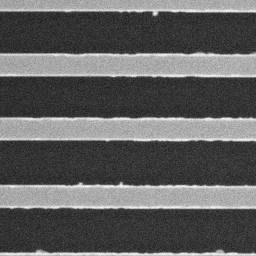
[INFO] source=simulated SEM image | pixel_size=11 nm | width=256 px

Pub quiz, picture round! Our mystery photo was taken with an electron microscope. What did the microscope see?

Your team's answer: lines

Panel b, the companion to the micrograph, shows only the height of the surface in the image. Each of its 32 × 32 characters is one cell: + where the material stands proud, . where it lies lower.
++++++++++++++++++++++++++++++++
................................
................................
................................
................................
................................
................................
++++++++++++++++++++++++++++++++
++++++++++++++++++++++++++++++++
..............+++..+++++++++++++
................................
................................
................................
................................
................................
++++++++++++++++++++++++++++++++
++++++++++++++++++++++++++++++++
.............+..++++++++.+++++++
................................
................................
................................
................................
................................
++++++++++++++++++++++++++++++++
++++++++++++++++++++++++++++++++
++++++++++++++++++++++++++++++++
................................
................................
................................
................................
................................
................................